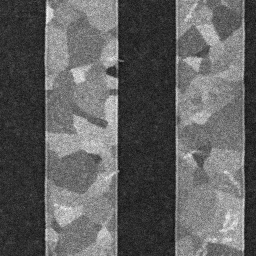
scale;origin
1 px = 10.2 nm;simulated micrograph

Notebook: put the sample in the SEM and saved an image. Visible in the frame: one or a few lines or trenches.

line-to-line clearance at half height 608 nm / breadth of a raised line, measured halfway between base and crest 0.7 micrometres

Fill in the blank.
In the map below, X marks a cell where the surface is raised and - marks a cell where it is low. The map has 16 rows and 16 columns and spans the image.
---XXXX----XXXX-
---XXXX----XXXX-
---XXXX----XXXX-
---XXXX----XXXX-
---XXXX----XXXX-
---XXXX----XXXX-
---XXXX----XXXX-
---XXXX----XXXX-
---XXXX----XXXX-
---XXXX----XXXX-
---XXXX----XXXX-
---XXXX----XXXX-
---XXXX----XXXX-
---XXXX----XXXX-
---XXXX----XXXX-
---XXXX----XXXX-